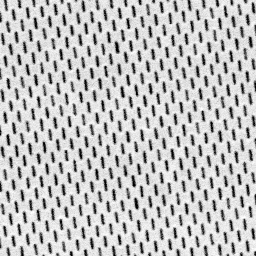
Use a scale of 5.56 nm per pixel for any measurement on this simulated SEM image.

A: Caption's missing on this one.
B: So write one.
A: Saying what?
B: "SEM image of a regular array of holes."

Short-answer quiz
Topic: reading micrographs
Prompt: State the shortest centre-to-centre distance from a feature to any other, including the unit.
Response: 0.0717 um